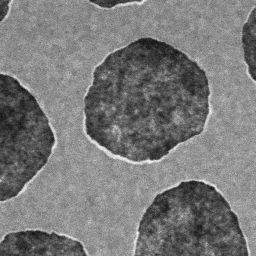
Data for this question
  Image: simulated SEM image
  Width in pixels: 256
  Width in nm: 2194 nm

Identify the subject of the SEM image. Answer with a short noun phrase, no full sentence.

holes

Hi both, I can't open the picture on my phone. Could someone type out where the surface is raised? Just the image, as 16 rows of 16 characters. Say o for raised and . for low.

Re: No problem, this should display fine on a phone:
.ooooooooooooooo
ooooooooooooooo.
ooooooooo.ooooo.
ooooooo.....ooo.
oooooo.......ooo
..oooo.......ooo
..ooo........ooo
...oo........ooo
...ooo......oooo
...oooo....ooooo
...ooooooooooooo
..ooooooooo..ooo
oooooooooo....oo
ooooooooo......o
o..oooooo......o
.....ooo.......o